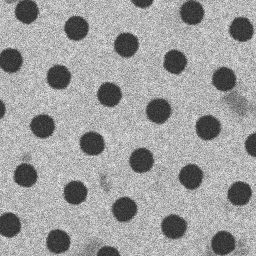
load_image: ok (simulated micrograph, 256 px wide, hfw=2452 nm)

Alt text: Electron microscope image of a regular array of holes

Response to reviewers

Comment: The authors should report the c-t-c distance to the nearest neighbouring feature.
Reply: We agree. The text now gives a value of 494 nm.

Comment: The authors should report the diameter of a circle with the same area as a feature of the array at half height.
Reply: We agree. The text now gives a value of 242 nm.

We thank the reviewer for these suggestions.